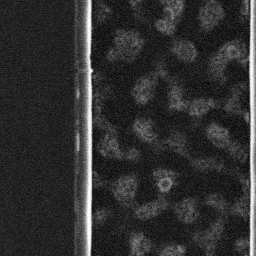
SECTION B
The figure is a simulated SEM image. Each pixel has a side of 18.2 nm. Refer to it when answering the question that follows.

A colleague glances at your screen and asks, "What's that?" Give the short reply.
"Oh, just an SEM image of one or a few lines or trenches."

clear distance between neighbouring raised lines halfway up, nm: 2920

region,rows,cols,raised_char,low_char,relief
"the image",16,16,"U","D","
UUUUUUDDDDDDDDDD
UUUUUUDDDDDDDDDD
UUUUUUDDDDDDDDDD
UUUUUUDDDDDDDDDD
UUUUUUDDDDDDDDDD
UUUUUUDDDDDDDDDD
UUUUUUDDDDDDDDDD
UUUUUUDDDDDDDDDD
UUUUUUDDDDDDDDDD
UUUUUUDDDDDDDDDD
UUUUUUDDDDDDDDDD
UUUUUUDDDDDDDDDD
UUUUUUDDDDDDDDDD
UUUUUUDDDDDDDDDD
UUUUUUDDDDDDDDDD
UUUUUUDDDDDDDDDD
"